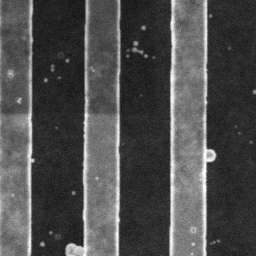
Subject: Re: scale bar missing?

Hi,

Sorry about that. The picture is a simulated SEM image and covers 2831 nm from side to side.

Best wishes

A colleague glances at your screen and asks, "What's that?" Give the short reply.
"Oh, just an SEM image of lines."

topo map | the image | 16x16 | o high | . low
oo...oo....oo...
oo...oo....oo...
oo...oo....oo...
oo...oo....oo...
oo...oo....oo...
oo...oo....oo...
oo...oo....oo...
oo...oo....oo...
oo...oo....oo...
oo...oo....oo...
oo...oo....oo...
oo...oo....oo...
oo...oo....oo...
oo...oo....oo...
oo...oo....oo...
oo...oo....oo...